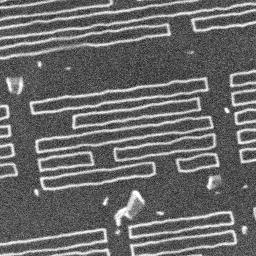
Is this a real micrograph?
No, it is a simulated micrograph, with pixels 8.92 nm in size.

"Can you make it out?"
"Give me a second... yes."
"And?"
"groups of lines, slits or small figures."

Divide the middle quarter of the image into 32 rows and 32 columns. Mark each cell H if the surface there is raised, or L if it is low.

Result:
LLLLLLLLLLLLLLLLLLLLLLLLLLLLLLLL
LLLLLLLLLLLLLLLLLLLLLLLLLLLLLLLL
LLLLLLLLLLLLLLLLLLLLLLLLLLLLLLLL
LLLLLLLLLLLLLLLLLLLLLLLLLLLLLLLL
LLLLLLLLLLLLLLLLLLLLLLLLLLLHHHHH
LLLLLLLLLLLLLLLLLLLLLLLHHHHHHHHH
LLLLLLLLLLLLLLLLHHHHHHHHHHHHHHHH
LLLLLLLLLHHHHHHHHHHHHHHHHHHHHLLL
HHHHHHHHHHHHHHHHHHHHLLLLLLLLLLLL
HHHHHHHHHHHHHLLLLLLLLLLLLLHHHHHH
HHHHHHHHLLLLLLLLLLLLLHHHHHHHHHHH
LLLLLLLLLLLLLLLLHHHHHHHHHHHHHHHH
LLLLLLHHHHHHHHHHHHHHHHHHHHHLLLLL
LLHHHHHHHHHHHHHHHHLLLLLLLLLLLLLL
LLHHHHHHHHHHLLLLLLLLLLLLLLLHHHHH
LLHHHLLLLLLLLLLLLLLLHHHHHHHHHHHH
LLLLLLLLLLLLLHHHHHHHHHHHHHHHHHHH
LLLLLHHHHHHHHHHHHHHHHHHHHLLLLLLL
HHHHHHHHHHHHHHHHHHLLLLLLLLLLLLHH
HHHHHHHHHHHHLLLLLLLLLLLLLLLHHHHH
HHHHLLLLLLLLLLLLLLLHHHHHHHHHHHHH
LLLLLLLLLLLLLHHHHHHHHHHHHHHHHHHH
LLLHHHHLLLLLLHHHHHHHHHHHHLLLLLLL
HHHHHHHLLLLLLHHHHHLLLLLLLLLLLLLL
HHHHHHHLLLLLLLLLLLLLLLLLLLLLHHHH
HHHLLLLLLLLLLLLLLHHHHHHLLLLLLHHH
LLLLLLLLLLLHHHHHHHHHHHHLLLLLLHHH
LLLHHHHHHHHHHHHHHHHHHHLLLLLLLLLL
HHHHHHHHHHHHHHHLLLLLLLLLLLLLLLLL
HHHHHHHHHHLLLLLLLLLLLLLLLLLLLLLL
HHLLLLLLLLLLLLLLLLLLLLLLLLLLLLLL
LLLLLLLLLLLLLLLLLLLLLLLLLLLLLLLL